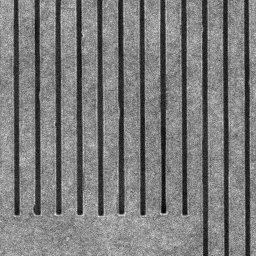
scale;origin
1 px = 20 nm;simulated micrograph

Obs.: parallel lines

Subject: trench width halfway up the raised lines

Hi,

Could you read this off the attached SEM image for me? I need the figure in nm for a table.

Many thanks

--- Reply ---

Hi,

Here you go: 108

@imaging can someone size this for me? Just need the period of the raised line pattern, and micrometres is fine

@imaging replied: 0.42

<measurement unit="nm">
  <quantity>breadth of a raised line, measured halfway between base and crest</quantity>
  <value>301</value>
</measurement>